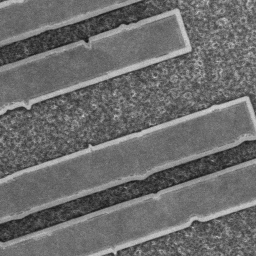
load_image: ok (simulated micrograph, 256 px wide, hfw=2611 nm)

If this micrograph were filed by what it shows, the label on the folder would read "one or a few lines or trenches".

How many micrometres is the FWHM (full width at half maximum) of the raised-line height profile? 0.396